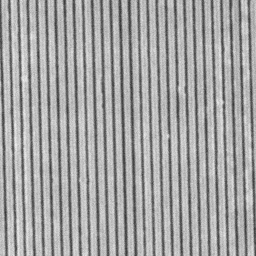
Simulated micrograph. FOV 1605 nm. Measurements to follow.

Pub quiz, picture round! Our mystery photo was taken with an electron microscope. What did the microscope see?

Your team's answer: parallel lines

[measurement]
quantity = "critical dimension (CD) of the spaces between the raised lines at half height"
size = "22.7 nm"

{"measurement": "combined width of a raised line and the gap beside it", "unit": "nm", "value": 57.7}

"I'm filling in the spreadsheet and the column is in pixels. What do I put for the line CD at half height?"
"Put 5.63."